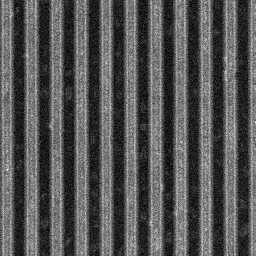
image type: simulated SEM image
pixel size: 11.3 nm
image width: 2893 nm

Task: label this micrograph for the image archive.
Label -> parallel lines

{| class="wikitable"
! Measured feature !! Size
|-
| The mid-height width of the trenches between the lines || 0.155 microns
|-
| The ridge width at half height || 122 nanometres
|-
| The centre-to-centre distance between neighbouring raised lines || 281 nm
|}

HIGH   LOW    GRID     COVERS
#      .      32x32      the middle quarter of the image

...###...###...###....##....###.
...###...###...###....##....###.
...###...###...###....##....###.
...###...###...###....##....###.
...###...###...###....##....##..
...###...###...###....###...##..
...##....###...###....###...##..
...##....###...###....##....##..
...###...###...###....##....##..
...###...###...###....##....##..
...###...###...###....##....##..
...###...###...###....##....##..
...###...###...###....##....###.
...###...###....##....##....###.
...###...###....##....##....###.
...###...###....##....##....###.
...###...###....##....##....###.
...###...###....##....##....###.
...###...###....##....##....###.
...###...###....##....##....###.
...###...###....##....##....###.
...###...###....##....##....###.
...###...###....##....##....###.
...###...###....##....##....###.
...###...###....##....##....###.
...###...###....##....##....###.
...###...###....##....##....###.
...###...###....##....##....###.
...###...###....##....##....###.
...###...###....##....##....###.
...###...###....##....###...###.
...###...###....##....###...###.